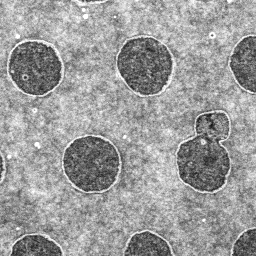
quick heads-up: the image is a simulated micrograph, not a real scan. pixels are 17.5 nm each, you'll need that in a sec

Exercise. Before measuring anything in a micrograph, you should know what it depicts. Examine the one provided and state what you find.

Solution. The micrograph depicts raised bodies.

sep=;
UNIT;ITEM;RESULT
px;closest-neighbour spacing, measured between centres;109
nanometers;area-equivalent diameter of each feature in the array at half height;1030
